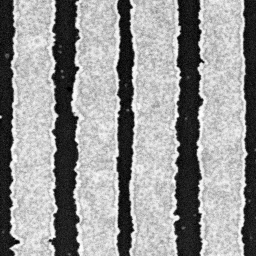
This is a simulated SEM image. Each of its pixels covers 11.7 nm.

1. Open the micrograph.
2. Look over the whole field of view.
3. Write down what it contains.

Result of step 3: one or a few lines or trenches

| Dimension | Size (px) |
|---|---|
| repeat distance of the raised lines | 62.9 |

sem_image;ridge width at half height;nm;483